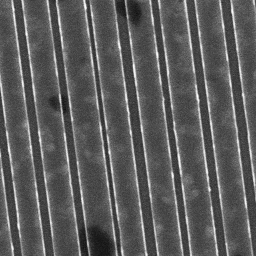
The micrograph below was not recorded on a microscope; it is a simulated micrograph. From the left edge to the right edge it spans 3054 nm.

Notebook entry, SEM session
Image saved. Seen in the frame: parallel lines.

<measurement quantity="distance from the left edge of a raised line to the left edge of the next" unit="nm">408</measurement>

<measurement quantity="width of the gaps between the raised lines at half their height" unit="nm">108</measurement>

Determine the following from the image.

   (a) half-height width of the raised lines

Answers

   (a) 305 nanometers